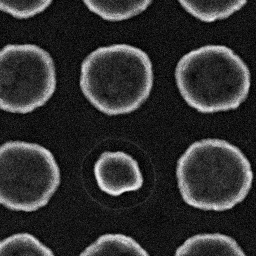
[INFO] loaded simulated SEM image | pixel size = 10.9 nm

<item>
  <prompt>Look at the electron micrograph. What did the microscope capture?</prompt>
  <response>raised bodies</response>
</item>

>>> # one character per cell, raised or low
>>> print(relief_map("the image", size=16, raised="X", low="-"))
XXX---XXX---XXX-
----------------
----------------
XXX---XXX---XXX-
XXX--XXXX--XXXX-
XXX--XXXX--XXXX-
XX----XXX---XXX-
----------------
----------------
XXX---------XXX-
XXXX--XXX--XXXXX
XXXX--XXX--XXXXX
XXX---------XXX-
----------------
----------------
XXX---XXX--XXXX-